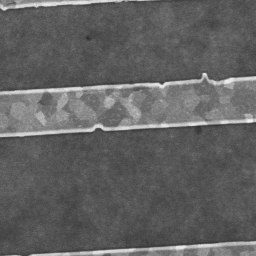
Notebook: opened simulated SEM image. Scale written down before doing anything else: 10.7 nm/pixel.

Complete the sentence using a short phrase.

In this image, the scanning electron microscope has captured one or a few lines or trenches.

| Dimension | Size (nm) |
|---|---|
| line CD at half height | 445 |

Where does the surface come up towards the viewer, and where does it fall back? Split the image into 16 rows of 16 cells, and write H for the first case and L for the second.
LLLLLLLLLLLLLLLL
LLLLLLLLLLLLLLLL
LLLLLLLLLLLLLLLL
LLLLLLLLLLLLLLLL
LLLLLLLLLLLLLLLL
LLLLLLHHHHHHHHHH
HHHHHHHHHHHHHHHH
HHHHHHHHHHHHHHHH
LLLLLLLLLLLLLLLL
LLLLLLLLLLLLLLLL
LLLLLLLLLLLLLLLL
LLLLLLLLLLLLLLLL
LLLLLLLLLLLLLLLL
LLLLLLLLLLLLLLLL
LLLLLLLLLLLLLLLL
LLLLLLLLLLLHHHHH